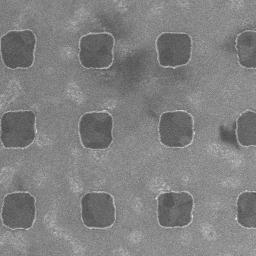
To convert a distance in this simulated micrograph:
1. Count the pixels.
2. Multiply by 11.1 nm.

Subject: raised bodies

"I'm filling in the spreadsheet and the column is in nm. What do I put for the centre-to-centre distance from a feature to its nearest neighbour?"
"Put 856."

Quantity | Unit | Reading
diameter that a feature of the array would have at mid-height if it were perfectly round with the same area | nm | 419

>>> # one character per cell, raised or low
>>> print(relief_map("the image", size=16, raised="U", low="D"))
DDDDDDDDDDDDDDDD
DDDDDDDDDDDDDDDD
UUDDDUUDDDUUDDDU
UUDDDUUDDDUUDDDU
DDDDDDDDDDDDDDDD
DDDDDDDDDDDDDDDD
DDDDDDDDDDDDDDDD
UUDDDUUDDDUUDDDU
UUDDDUUDDDUUDDDU
DDDDDDDDDDDDDDDD
DDDDDDDDDDDDDDDD
DDDDDDDDDDDDDDDD
UUDDDUUDDDUUDDDU
UUDDDUUDDDUUDDDU
DDDDDDDDDDDDDDDD
DDDDDDDDDDDDDDDD